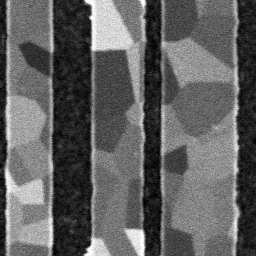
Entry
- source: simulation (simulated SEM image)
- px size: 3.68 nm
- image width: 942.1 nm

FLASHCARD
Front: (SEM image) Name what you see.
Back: one or a few lines or trenches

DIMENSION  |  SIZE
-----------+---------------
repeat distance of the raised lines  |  0.312 um